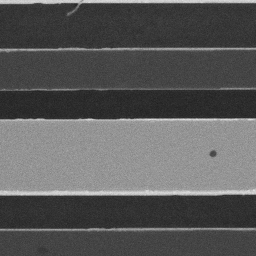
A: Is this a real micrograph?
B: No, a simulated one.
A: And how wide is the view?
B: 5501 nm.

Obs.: lines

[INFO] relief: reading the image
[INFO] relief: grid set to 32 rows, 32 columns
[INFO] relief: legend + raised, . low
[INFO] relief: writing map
................................
................................
................................
................................
................................
................................
++++++++++++++++++++++++++++++++
++++++++++++++++++++++++++++++++
++++++++++++++++++++++++++++++++
++++++++++++++++++++++++++++++++
++++++++++++++++++++++++++++++++
................................
................................
................................
................................
++++++++++++++++++++++++++++++++
++++++++++++++++++++++++++++++++
++++++++++++++++++++++++++++++++
++++++++++++++++++++++++++++++++
++++++++++++++++++++++++++++++++
++++++++++++++++++++++++++++++++
++++++++++++++++++++++++++++++++
++++++++++++++++++++++++++++++++
++++++++++++++++++++++++++++++++
................................
................................
................................
................................
................................
++++++++++++++++++++++++++++++++
++++++++++++++++++++++++++++++++
++++++++++++++++++++++++++++++++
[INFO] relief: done